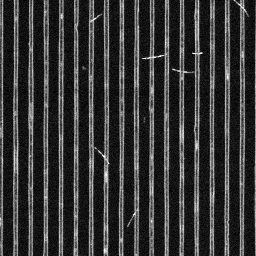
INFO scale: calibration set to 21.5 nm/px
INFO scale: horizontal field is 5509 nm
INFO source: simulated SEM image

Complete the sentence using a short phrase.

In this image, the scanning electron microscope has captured parallel lines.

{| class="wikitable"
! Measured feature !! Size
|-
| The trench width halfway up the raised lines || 0.239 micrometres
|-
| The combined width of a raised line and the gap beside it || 325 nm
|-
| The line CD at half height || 80.7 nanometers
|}